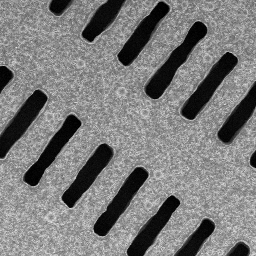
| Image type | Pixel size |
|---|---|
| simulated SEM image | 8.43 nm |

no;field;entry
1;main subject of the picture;holes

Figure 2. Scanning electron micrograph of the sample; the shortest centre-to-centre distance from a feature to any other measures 356 nm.